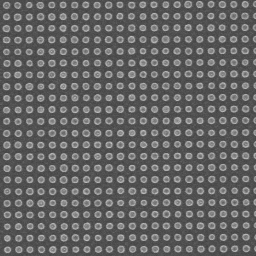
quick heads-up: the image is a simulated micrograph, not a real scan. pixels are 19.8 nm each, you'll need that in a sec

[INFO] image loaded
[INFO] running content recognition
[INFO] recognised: a regular array of raised bodies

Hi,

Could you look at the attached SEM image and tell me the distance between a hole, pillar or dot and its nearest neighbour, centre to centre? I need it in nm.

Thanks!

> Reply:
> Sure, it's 222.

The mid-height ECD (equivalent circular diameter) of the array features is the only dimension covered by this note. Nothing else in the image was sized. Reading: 128 nm